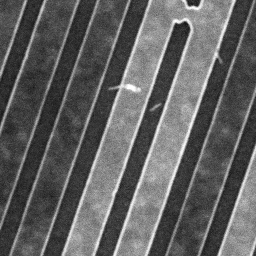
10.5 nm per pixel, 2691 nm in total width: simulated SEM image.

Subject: parallel lines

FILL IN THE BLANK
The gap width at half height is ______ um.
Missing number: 0.188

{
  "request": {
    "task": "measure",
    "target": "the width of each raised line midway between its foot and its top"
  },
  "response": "327 nm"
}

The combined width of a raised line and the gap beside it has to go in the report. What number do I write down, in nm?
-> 519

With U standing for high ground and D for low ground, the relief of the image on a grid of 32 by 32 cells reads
UUUDDUUUUUDDUUUUDDDUUUUDDUUUUDDD
UUUDDUUUUDDDUUUUDDUUUUUUUUUUUDDU
UUDDDUUUUDDUUUUDDDUUUUUUUUUUUDDU
UUDDUUUUUDDUUUUDDDUUUUDDUUUUDDDU
UUDDUUUUDDDUUUUDDUUUUDDDUUUUDDUU
UDDDUUUUDDUUUUDDDUUUUDDUUUUDDDUU
UDDUUUUUDDUUUUDDDUUUDDDUUUUDDUUU
UDDUUUUDDDUUUUDDUUUUDDDUUUUDDUUU
DDDUUUUDDUUUUDDDUUUUDDUUUUDDDUUU
DDUUUUUDDUUUUDDDUUUDDDUUUUDDUUUU
DDUUUUDDDUUUUDDUUUUDDDUUUUDDUUUU
DDUUUUDDUUUUDDDUUUUDDUUUUDDDUUUU
DUUUUUDDUUUUDDDUUUDDDUUUUDDUUUUU
DUUUUDDDUUUUDDUUUUDDDUUUUDDUUUUD
DUUUUDDUUUUDDDUUUUDDUUUUDDDUUUUD
UUUUUDDUUUUDDUUUUDDDUUUUDDUUUUUD
UUUUDDDUUUUDDUUUUDDDUUUUDDUUUUDD
UUUUDDUUUUDDDUUUUDDUUUUDDDUUUUDD
UUUUDDUUUUDDUUUUDDDUUUUDDUUUUUDD
UUUDDDUUUUDDUUUUDDDUUUUDDUUUUDDD
UUUDDUUUUDDDUUUUDDUUUUDDDUUUUDDU
UUDDDUUUUDDUUUUDDDUUUUDDUUUUUDDU
UUDDUUUUDDDUUUUDDDUUUUDDUUUUDDDU
UUDDUUUUDDDUUUUDDUUUUDDDUUUUDDUU
UDDDUUUUDDUUUUDDDUUUUDDUUUUUDDUU
UDDUUUUDDDUUUUDDUUUUUDDUUUUDDDUU
UDDUUUUDDDUUUUDDUUUUDDDUUUUDDUUU
DDDUUUUDDUUUUDDDUUUUDDUUUUDDDUUU
DDUUUUDDDUUUUDDUUUUUDDUUUUDDUUUU
DDUUUUDDDUUUUDDUUUUDDDUUUUDDUUUU
DDUUUUDDUUUUDDDUUUUDDUUUUDDDUUUU
DUUUUDDDUUUUDDUUUUUDDUUUUDDUUUUU